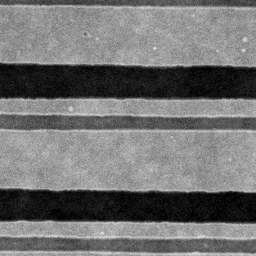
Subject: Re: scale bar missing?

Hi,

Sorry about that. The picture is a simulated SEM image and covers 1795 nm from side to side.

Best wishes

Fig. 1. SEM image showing lines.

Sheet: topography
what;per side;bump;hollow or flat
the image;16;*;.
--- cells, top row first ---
****************
****************
****************
****************
................
................
****************
****************
****************
****************
****************
****************
................
................
****************
****************